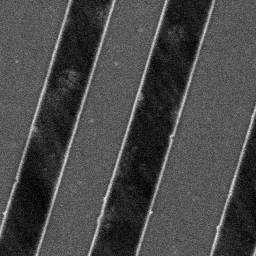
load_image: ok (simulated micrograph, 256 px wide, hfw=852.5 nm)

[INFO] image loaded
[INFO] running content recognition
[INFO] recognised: one or a few lines or trenches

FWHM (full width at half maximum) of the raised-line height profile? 155 nm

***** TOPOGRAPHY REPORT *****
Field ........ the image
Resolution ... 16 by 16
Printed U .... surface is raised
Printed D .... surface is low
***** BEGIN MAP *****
DDDDUUUDDDUUUDDD
DDDDUUUDDDUUUDDD
DDDDUUDDDDUUUDDD
DDDUUUDDDUUUDDDD
DDDUUUDDDUUUDDDD
DDDUUUDDDUUUDDDD
DDUUUDDDUUUDDDDD
DDUUUDDDUUUDDDDD
DDUUUDDDUUUDDDDU
DUUUDDDDUUUDDDDU
DUUUDDDUUUDDDDDU
DUUUDDDUUUDDDDDU
DUUDDDDUUUDDDDUU
UUUDDDUUUDDDDDUU
UUUDDDUUUDDDDDUU
UUDDDDUUUDDDDUUU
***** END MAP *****